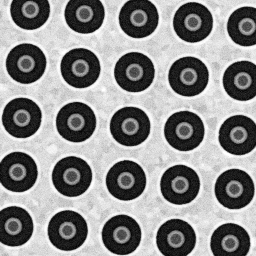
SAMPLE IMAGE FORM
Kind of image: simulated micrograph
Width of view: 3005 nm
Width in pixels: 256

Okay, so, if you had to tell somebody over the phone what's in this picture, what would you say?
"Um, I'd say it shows an array of small figures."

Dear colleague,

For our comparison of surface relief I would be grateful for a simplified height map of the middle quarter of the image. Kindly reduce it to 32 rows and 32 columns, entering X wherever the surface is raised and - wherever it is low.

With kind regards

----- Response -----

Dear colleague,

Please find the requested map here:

---XXX---XXX-----X-----XXX------
--XXXX----XX----XXX----XXX------
---XX----XXX----XXX----XXX----XX
---------XXX----XXX----XXX----XX
--------XXXXX----------XXX----XX
X------XXXXXXX--------XXXX------
XXXXXXXXXXXXXXX------XXXXXX-----
XXXXXXXXXXXXXXXXXXXXXXXXXXXX----
XXXXXXXXXXXXXXXXXXXXXXXXXXXXXXX-
X----XXXXXXXXXXXXXXXXXXXXXXXXXXX
-------XXXXXXXX---XXXXXXXXXXXXXX
-------XXXXXX-------XXXXXXXXX--X
--------XXXX---------XXXXXX-----
--XX----XXXX----------XXXX------
-XXXX---XXX----XXX----XXX-------
--XX----XXX----XXX----XXX----XX-
--------XXX----XXX----XXX---XXXX
-------XXXX-----------XXX----XXX
-------XXXXX---------XXXX-------
X----XXXXXXXX-------XXXXX-------
XXXXXXXXXXXXXX-----XXXXXXX------
XXXXXXXXXXXXXXXXXXXXXXXXXXXX----
XXXXXXXXXXXXXXXXXXXXXXXXXXXXXXXX
-----XXXXXXXXXXXXXXXXXXXXXXXXXXX
------XXXXXXX-----XXXXXXXXXXXXXX
-------XXXXX-------XXXXXXXX-----
-X-----XXXX---------XXXXX-------
XXXX---XXX-----------XXXX-------
XXX----XXX----XXX----XXX--------
-XX----XXX----XXX----XXX---XXXX-
-------XXX----XX-----XXX---XXXX-
------XXXXX---------XXXX----XX--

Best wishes